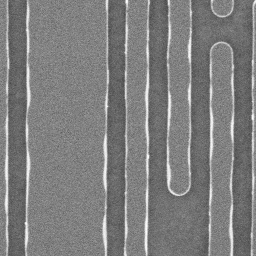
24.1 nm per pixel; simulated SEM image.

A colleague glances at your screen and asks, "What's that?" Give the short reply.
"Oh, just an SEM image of groups of lines, slits or small figures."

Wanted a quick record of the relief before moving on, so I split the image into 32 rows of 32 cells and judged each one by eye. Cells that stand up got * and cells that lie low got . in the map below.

*..**********...***..***...**...
*...*********...***..***...**...
*..**********...**...***........
*..**********...**...***........
*...*********...**...***........
*...*********...**...***...*....
*..**********...**...***..***...
*..**********...**...***..***...
*..**********...**...***..***...
*...*********...**...***..***...
*...*********...**...***..***...
*...*********...**...***..***...
*...*********...**...***..***...
*..**********...**...***..***...
*..**********...**...***..***...
*..**********...**...***...**...
*..**********...**...***...**...
*..**********...**...***...**...
*..**********...**...***..***...
*...*********...**...***..***...
*...*********...**...***..***...
*...*********...**...***..***...
*..**********...**...***..***...
*..**********...**...***..***...
*..**********...**........***...
*..**********...**........***...
*..**********...**........***...
*..**********...**........***...
*..**********...**........***...
*..**********...**........***...
*..**********...**........***...
*..**********...**........***...